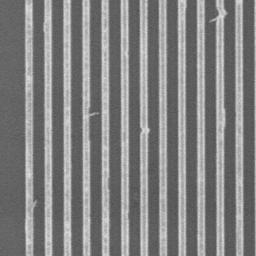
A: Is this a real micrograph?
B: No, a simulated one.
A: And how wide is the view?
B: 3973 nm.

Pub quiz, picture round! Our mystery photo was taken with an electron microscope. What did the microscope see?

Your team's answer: parallel lines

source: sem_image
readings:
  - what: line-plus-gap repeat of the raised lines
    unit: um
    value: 0.296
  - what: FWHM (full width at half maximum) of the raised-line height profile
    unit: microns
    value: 0.0756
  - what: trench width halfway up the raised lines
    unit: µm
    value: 0.221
